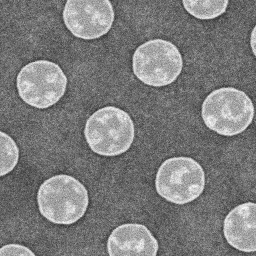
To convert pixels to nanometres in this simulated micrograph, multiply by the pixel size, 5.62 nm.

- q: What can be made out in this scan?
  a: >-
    raised bodies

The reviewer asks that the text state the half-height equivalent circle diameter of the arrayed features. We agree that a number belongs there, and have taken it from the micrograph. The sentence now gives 0.271 µm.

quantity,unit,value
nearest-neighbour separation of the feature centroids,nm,468